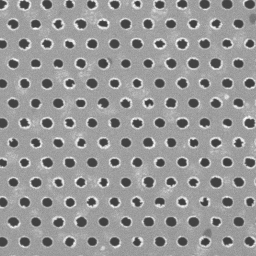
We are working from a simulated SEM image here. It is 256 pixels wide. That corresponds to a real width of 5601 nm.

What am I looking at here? a regular array of holes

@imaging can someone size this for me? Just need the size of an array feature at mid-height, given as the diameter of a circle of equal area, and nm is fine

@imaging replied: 209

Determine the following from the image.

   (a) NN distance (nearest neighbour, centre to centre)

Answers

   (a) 487 nm